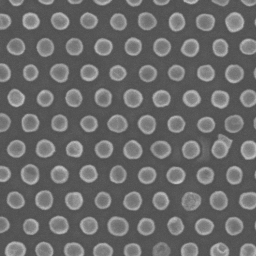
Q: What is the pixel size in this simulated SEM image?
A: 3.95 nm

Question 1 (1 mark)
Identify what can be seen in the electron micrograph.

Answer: a regular array of raised bodies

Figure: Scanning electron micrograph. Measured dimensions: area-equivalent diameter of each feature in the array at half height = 65.9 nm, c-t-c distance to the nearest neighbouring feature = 0.113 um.